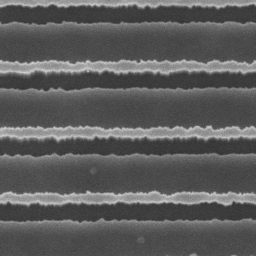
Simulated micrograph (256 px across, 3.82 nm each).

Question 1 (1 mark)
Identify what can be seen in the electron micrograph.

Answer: lines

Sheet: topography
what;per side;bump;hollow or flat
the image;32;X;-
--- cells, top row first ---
XXXXXXXXXXXXXXXXXXXXXXXXXXXXXXX-
--------------------------------
--------------------------------
XXXXXXXXXXXXXXXXXXXXXXXXXXXXXXXX
XXXXXXXXXXXXXXXXXXXXXXXXXXXXXXXX
XXXXXXXXXXXXXXXXXXXXXXXXXXXXXXXX
XXXXXXXXXXXXXXXXXXXXXXXXXXXXXXXX
XXXXXXXXXXXXXXXXXXXXXXXXXXXXXXXX
XXXXXXXXXXXXXXXXXXXXXXXXXXXXXXXX
--------------------------------
--------------------------------
XXXXXXXXXXXXXXXXXXXXXXXXXXXXXXXX
XXXXXXXXXXXXXXXXXXXXXXXXXXXXXXXX
XXXXXXXXXXXXXXXXXXXXXXXXXXXXXXXX
XXXXXXXXXXXXXXXXXXXXXXXXXXXXXXXX
XXXXXXXXXXXXXXXXXXXXXXXXXXXXXXXX
XXXXXXXXXXXXXXXXXXXXXXXXXXXXXXXX
--------------------------------
--------------------------------
X-XX--XXXXXXXXXXXXXXXXXXXXXXXXXX
XXXXXXXXXXXXXXXXXXXXXXXXXXXXXXXX
XXXXXXXXXXXXXXXXXXXXXXXXXXXXXXXX
XXXXXXXXXXXXXXXXXXXXXXXXXXXXXXXX
XXXXXXXXXXXXXXXXXXXXXXXXXXXXXXXX
XXXXXXXXXXXXXXXXXXXXXXXXXXXXXXXX
-----X----------------------X---
--------------------------------
------------X-----------------XX
XXXXXXXXXXXXXXXXXXXXXXXXXXXXXXXX
XXXXXXXXXXXXXXXXXXXXXXXXXXXXXXXX
XXXXXXXXXXXXXXXXXXXXXXXXXXXXXXXX
XXXXXXXXXXXXXXXXXXXXXXXXXXXXXXXX